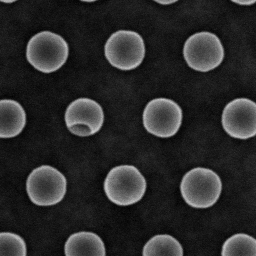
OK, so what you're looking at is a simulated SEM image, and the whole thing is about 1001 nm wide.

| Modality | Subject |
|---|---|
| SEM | a regular array of raised bodies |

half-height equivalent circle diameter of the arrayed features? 154 nm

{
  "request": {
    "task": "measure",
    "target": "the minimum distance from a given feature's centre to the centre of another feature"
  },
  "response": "0.3 microns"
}